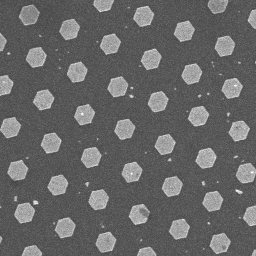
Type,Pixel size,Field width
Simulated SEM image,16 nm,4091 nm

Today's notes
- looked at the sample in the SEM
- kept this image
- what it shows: a regular array of raised bodies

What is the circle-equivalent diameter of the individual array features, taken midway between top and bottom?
310 nanometres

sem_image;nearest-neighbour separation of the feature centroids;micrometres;0.685